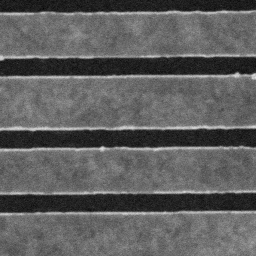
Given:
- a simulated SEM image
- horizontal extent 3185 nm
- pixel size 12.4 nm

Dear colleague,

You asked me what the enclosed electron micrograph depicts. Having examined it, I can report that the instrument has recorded lines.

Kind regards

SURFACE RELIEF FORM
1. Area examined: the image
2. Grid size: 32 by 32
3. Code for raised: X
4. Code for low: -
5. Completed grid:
--------------------------------
---------------------XX-X--XXXXX
XXXXXXXXXXXXXXXXXXXXXXXXXXXXXXXX
XXXXXXXXXXXXXXXXXXXXXXXXXXXXXXXX
XXXXXXXXXXXXXXXXXXXXXXXXXXXXXXXX
XXXXXXXXXXXXXXXXXXXXXXXXXXXXXXXX
XXXXXXXXXXXXXXXXXXXXXXXXXXXXXXXX
--------------------------------
--------------------------------
--------------XXXXXXXXXXXXXXXXXX
XXXXXXXXXXXXXXXXXXXXXXXXXXXXXXXX
XXXXXXXXXXXXXXXXXXXXXXXXXXXXXXXX
XXXXXXXXXXXXXXXXXXXXXXXXXXXXXXXX
XXXXXXXXXXXXXXXXXXXXXXXXXXXXXXXX
XXXXXXXXXXXXXXXXXXXXXXXXXXXXXXXX
XXXXXXXXXXXXXXXXXXXXXXXXXXXXXXXX
--------------------------------
--------------------------------
------------XXXX----XXXXXXXXXXXX
XXXXXXXXXXXXXXXXXXXXXXXXXXXXXXXX
XXXXXXXXXXXXXXXXXXXXXXXXXXXXXXXX
XXXXXXXXXXXXXXXXXXXXXXXXXXXXXXXX
XXXXXXXXXXXXXXXXXXXXXXXXXXXXXXXX
XXXXXXXXXXXXXXXXXXXXXXXXXXXXXXXX
--------------------------------
--------------------------------
----------------------XX-XXXXXXX
XXXXXXXXXXXXXXXXXXXXXXXXXXXXXXXX
XXXXXXXXXXXXXXXXXXXXXXXXXXXXXXXX
XXXXXXXXXXXXXXXXXXXXXXXXXXXXXXXX
XXXXXXXXXXXXXXXXXXXXXXXXXXXXXXXX
XXXXXXXXXXXXXXXXXXXXXXXXXXXXXXXX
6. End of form